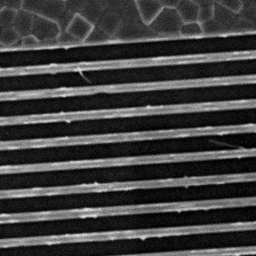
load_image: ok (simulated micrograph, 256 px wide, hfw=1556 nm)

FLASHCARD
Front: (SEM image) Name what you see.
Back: parallel lines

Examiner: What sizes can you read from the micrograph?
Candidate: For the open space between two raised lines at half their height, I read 100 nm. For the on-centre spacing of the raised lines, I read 148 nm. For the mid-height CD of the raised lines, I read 8.11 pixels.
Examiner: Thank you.